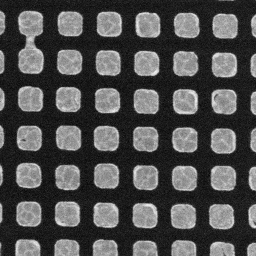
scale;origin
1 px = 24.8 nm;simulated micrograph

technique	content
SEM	a regular array of raised bodies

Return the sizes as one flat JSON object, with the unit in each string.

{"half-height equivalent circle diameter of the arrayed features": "25.7 px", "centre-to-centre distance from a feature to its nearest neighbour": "934 nanometers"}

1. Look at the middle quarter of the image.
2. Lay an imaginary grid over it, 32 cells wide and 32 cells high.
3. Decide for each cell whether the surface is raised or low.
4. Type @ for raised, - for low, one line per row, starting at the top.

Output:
@@@@----@@@@@@----@@@@@@---@@@@@
@@@@----@@@@@@----@@@@@@---@@@@@
---------@@@@------@@@@-----@@@@
--------------------------------
--------------------------------
--------------------------------
@@@@-----@@@@-------------------
@@@@----@@@@@@----@@@@@-----@@@@
@@@@----@@@@@@----@@@@@----@@@@@
@@@@----@@@@@@----@@@@@----@@@@@
@@@@----@@@@@@----@@@@@-----@@@@
@@@-----@@@@------@@@@@-----@@@@
--------------------------------
--------------------------------
--------------------------------
--------------------------------
@@@@----@@@@@-----@@@@@-----@@@@
@--@----@@@@@-----@@@@@----@@@@@
@@@@----@@@@@@-------@-----@@--@
@@@@----@@@@@-------@@@----@@@@@
@@@@----@@@@@-----@@@@@----@@@@@
----------@--------@@@@-----@@@@
--------------------------------
--------------------------------
--------------------------------
@@------@@@@@-------------------
@@@-----@@@@@----@@@@@@-----@-@@
@@@@----@@@@@----@@@@@@----@@-@@
@@@@----@@@@@@----@@@@@----@@@@@
@@@@----@@@@@@----@@@@@----@@@@@
@@@@----@@@@@-----@@@@@----@@@@@
--------------------------------